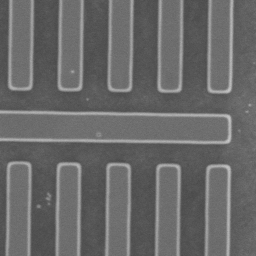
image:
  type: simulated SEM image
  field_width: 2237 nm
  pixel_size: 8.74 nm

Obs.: groups of lines, slits or small figures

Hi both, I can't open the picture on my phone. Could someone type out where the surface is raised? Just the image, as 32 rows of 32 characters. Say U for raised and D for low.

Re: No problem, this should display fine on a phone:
DUUUDDDDUUDDDDUUUDDDUUUDDDUUUDDD
DUUUDDDDUUDDDDUUUDDDUUUDDDUUUDDD
DUUUDDDDUUDDDDUUUDDDUUUDDDUUUDDD
DUUUDDDDUUDDDDUUUDDDUUUDDDUUUDDD
DUUUDDDUUUDDDDUUUDDDUUUDDDUUUDDD
DUUUDDDUUUDDDDUUUDDDUUUDDDUUUDDD
DUUUDDDUUUDDDDUUDDDDUUUDDDUUUDDD
DUUUDDDUUUDDDDUUDDDDUUUDDDUUUDDD
DUUUDDDUUUDDDDUUDDDDUUUDDDUUUDDD
DUUUDDDUUUDDDDUUDDDDUUUDDDUUUDDD
DUUUDDDUUUDDDDUUDDDDUUUDDDUUUDDD
DDDDDDDDDDDDDDDDDDDDDDDDDDUUDDDD
DDDDDDDDDDDDDDDDDDDDDDDDDDDDDDDD
DDDDDDDDDDDDDDDDDDDDDDDDDDDDDDDD
UUUUUUUUUUUUUUUUUUUUUUUUUUUUDDDD
UUUUUUUUUUUUUUUUUUUUUUUUUUUUUDDD
UUUUUUUUUUUUUUUUUUUUUUUUUUUUUDDD
DUUUUUUUUUUUUUUUUUUUUUUUUUUUUDDD
DDDDDDDDDDDDDDDDDDDDDDDDDDDDDDDD
DDDDDDDDDDDDDDDDDDDDDDDDDDDDDDDD
DUUDDDDDUUDDDDUUDDDDDDDDDDDDDDDD
DUUUDDDUUUDDDUUUDDDDUUDDDDUUUDDD
DUUUDDDUUUDDDUUUDDDDUUDDDDUUUDDD
DUUUDDDUUUDDDUUUDDDDUUDDDDUUUDDD
DUUUDDDUUUDDDUUUDDDDUUDDDDUUUDDD
DUUUDDDUUUDDDUUUDDDDUUDDDDUUUDDD
DUUUDDDUUUDDDUUUDDDDUUDDDDUUUDDD
DUUUDDDUUUDDDUUUDDDDUUDDDDUUUDDD
DUUUDDDUUUDDDUUUDDDDUUDDDDUUUDDD
DUUUDDDUUUDDDUUUDDDDUUDDDDUUUDDD
DUUUDDDUUUDDDUUUDDDDUUDDDDUUUDDD
DUUUDDDUUUDDDUUUDDDUUUDDDDUUDDDD